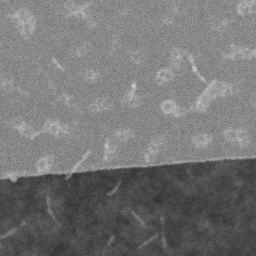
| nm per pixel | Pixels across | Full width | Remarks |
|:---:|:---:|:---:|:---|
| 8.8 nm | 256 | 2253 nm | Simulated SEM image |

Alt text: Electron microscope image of one or a few lines or trenches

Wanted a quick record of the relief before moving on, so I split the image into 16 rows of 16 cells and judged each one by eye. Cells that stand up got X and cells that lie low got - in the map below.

XXXXXXXXXXXXXXXX
XXXXXXXXXXXXXXXX
XXXXXXXXXXXXXXXX
XXXXXXXXXXXXXXXX
XXXXXXXXXXXXXXXX
XXXXXXXXXXXXXXXX
XXXXXXXXXXXXXXXX
XXXXXXXXXXXXXXXX
XXXXXXXXXXXXXXXX
XXXXXXXXXXXXXXXX
XXXXXXX---------
----------------
----------------
----------------
----------------
----------------